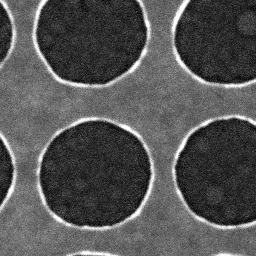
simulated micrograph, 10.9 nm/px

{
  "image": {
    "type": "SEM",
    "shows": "holes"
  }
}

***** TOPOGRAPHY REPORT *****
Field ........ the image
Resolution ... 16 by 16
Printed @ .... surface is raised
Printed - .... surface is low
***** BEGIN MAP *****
@@@------@@-----
-@-------@@-----
-@-------@@-----
@@@------@@-----
@@@-----@@@@----
@@@@@@@@@@@@@@@@
@@@@@@@@@@@@@@@@
@@@@@@@@@@@@@@-@
@@@@-----@@@----
-@@------@@-----
-@@------@@-----
-@@------@@-----
@@@------@@@----
@@@@----@@@@----
@@@@@@@@@@@@@@@@
@@@@@@@@@@@@@@@@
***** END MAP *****